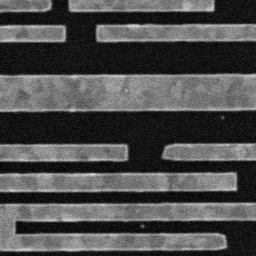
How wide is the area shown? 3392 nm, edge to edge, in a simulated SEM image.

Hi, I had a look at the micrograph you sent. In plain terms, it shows wiring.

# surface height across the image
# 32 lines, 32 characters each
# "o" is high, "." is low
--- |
oooooo...oooooooooooooooooo.....
................................
................................
oooooooo....oooooooooooooooooooo
oooooooo....oooooooooooooooooooo
................................
................................
................................
................................
o.oooooooooooooooooooooooooooooo
oooooooooooooooooooooooooooooooo
oooooooooooooooooooooooooooooooo
oooooooooooooooooooooooooooooooo
oooooooooooooooooooooooooooooooo
................................
................................
................................
................................
oooooooooooooooo.....ooooooooooo
oooooooooooooooo....oooooooooooo
................................
................................
ooooooooooooooooooooooooooooo...
ooooooooooooooooooooooooooooo...
................................
....................oooooooooooo
oooooooooooooooooooooooooooooooo
oooooooooo.....o................
oo..............................
oooooooooooooooooooooooooooo....
oooooooooooooooooooooooooooo....
................................